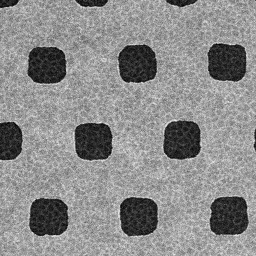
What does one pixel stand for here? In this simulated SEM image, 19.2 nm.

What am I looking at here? a regular array of holes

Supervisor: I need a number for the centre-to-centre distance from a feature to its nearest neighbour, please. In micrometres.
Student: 1.69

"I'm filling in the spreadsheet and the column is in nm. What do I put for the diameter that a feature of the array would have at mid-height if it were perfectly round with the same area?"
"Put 790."